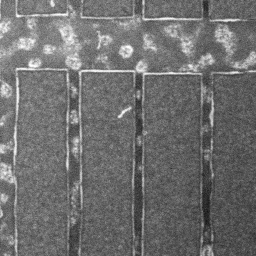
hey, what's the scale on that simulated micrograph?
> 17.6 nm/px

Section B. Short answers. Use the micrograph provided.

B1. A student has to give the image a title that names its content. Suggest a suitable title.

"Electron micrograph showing one or a few lines or trenches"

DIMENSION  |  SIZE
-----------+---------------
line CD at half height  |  0.952 µm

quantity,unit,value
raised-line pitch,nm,1150